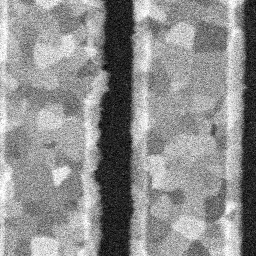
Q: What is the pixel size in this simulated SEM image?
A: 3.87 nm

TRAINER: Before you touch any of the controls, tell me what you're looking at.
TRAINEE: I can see one or a few lines or trenches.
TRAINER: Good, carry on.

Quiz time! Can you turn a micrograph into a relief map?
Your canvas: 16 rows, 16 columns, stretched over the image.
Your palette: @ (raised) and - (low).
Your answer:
@@@@@@---@@@@@@-
@@@@@@---@@@@@@-
@@@@@@---@@@@@@-
@@@@@@---@@@@@@-
@@@@@@---@@@@@@-
@@@@@@---@@@@@@-
@@@@@@---@@@@@@-
@@@@@@---@@@@@@-
@@@@@@---@@@@@@-
@@@@@@---@@@@@@-
@@@@@@---@@@@@@-
@@@@@----@@@@@@-
@@@@@@---@@@@@@-
@@@@@@---@@@@@@-
@@@@@@---@@@@@--
@@@@@@---@@@@@--